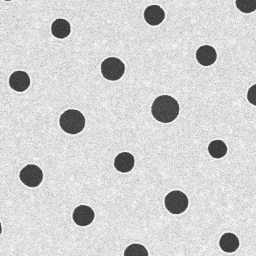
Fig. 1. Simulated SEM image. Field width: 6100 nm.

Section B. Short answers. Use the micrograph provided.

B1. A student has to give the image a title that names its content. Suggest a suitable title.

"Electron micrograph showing a regular array of holes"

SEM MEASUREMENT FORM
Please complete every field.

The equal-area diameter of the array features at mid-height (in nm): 521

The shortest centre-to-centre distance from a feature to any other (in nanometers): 1570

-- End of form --